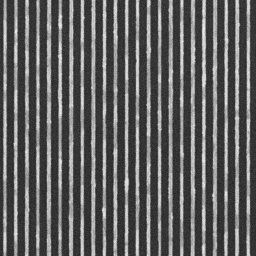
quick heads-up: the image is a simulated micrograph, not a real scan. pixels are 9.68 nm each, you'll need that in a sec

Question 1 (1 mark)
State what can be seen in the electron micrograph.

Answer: parallel lines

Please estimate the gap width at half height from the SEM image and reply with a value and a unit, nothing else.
8.25 pixels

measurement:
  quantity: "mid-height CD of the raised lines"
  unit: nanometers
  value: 25.4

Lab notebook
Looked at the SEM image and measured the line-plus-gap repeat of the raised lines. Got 107 nanometres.